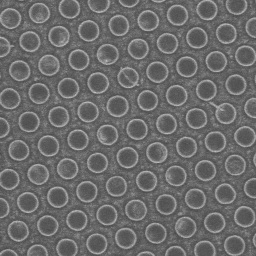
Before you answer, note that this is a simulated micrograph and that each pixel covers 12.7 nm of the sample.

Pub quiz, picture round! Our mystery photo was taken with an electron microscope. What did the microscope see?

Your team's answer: a regular array of raised bodies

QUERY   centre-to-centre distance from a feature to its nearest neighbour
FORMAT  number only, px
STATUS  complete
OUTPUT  29.7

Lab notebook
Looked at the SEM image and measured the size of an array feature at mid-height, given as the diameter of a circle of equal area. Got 0.256 micrometres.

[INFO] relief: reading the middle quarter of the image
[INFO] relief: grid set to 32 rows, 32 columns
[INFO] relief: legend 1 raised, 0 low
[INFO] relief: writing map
00111100000000000000011110001111
00000000000000111000011111001111
00000001100000111100011111000111
00000011111001111110011110000000
11100011111000111100000100000000
11110011111000011000000000011000
11110001110000000000000000111100
11100000000000000001111000111110
00000000000011100001111000111110
00000000000111110001111000111100
00001111000111110001111000000000
00001111000111110000100000000000
10001111000011100000000000000001
10001111000000000000000011100001
10000000000000001111000111110001
00000000001100001111100111110001
00000000011110001111100011110000
01111000111110001111000000000000
01111100011110000111000000000010
01111100011110000000000000001111
00111000000000000000011110001111
00000000000000111100011111001111
00000000100001111100011111000111
00000011110001111100011110000000
11100011111000111100001100000000
11100011111000011000000000000000
11100001110000000000000000111100
11100000000000000001110000111100
11000000000011100011111000111100
00000110000111100011111000111100
00001111000111110011111000000000
00011111000111100000110000000000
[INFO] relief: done